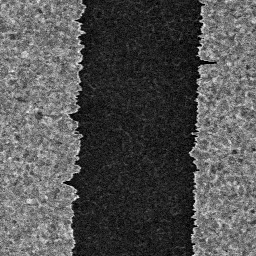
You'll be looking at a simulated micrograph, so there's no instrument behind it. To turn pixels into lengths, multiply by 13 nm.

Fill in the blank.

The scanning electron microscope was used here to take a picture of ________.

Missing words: one or a few lines or trenches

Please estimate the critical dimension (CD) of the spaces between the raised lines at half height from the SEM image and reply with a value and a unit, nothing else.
1560 nm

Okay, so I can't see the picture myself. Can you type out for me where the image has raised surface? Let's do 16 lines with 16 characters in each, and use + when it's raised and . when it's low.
+++++........+++
+++++........+++
+++++........+++
+++++........+++
+++++........+++
+++++.......++++
+++++.......++++
+++++.......++++
+++++.......++++
+++++.......++++
+++++.......++++
++++........++++
+++++.......++++
+++++.......++++
++++........++++
+++++.......++++